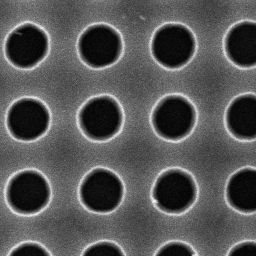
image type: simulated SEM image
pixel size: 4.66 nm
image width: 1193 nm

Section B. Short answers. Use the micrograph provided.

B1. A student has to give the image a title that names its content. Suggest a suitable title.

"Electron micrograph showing a regular array of holes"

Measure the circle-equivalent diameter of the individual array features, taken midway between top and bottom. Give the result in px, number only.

41.9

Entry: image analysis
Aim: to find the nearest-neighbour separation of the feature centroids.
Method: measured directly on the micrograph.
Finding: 338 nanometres